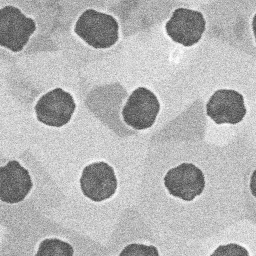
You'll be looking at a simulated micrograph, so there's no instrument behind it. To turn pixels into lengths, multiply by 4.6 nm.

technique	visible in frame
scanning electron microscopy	holes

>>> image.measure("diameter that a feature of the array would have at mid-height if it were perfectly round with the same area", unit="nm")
182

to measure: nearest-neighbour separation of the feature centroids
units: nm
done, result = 392